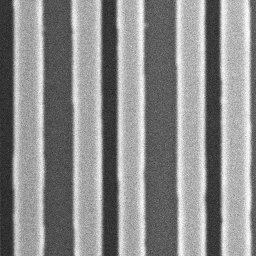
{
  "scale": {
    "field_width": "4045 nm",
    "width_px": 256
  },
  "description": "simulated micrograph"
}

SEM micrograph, lines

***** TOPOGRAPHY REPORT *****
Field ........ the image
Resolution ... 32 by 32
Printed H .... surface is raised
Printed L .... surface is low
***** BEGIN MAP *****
LLHHHLLLLHHHHLLHHHLLLLHHHHLLHHHL
LLHHHLLLLHHHHLLHHHLLLLHHHHLLHHHL
LLHHHLLLLHHHHLLHHHLLLLHHHHLLHHHL
LLHHHLLLLHHHHLLHHHLLLLHHHHLLHHHL
LLHHHLLLLHHHHLLHHHLLLLHHHHLLHHHL
LLHHHLLLLHHHHLLHHHLLLLHHHHLLHHHL
LLHHHLLLLHHHHLLHHHLLLLHHHHLLHHHL
LLHHHLLLLHHHHLLHHHLLLLHHHHLLHHHL
LLHHHLLLLHHHHLLHHHLLLLHHHHLLHHHL
LLHHHLLLLHHHHLLHHHLLLLHHHHLLHHHL
LLHHHLLLLHHHHLLHHHLLLLHHHHLLHHHL
LLHHHLLLLHHHHLLHHHLLLLHHHHLLHHHL
LLHHHLLLLHHHHLLHHHLLLLHHHHLLHHHL
LLHHHLLLLHHHHLLHHHLLLLHHHHLLHHHL
LLHHHLLLLHHHHLLHHHLLLLHHHHLLHHHL
LLHHHLLLLHHHHLLHHHLLLLHHHHLLHHHL
LLHHHLLLLHHHHLLHHHLLLLHHHHLLHHHL
LLHHHLLLLHHHHLLHHHLLLLHHHHLLHHHL
LLHHHLLLLHHHHLLHHHLLLLHHHHLLHHHL
LLHHHLLLLHHHHLLHHHLLLLHHHHLLHHHL
LLHHHLLLLHHHHLLHHHLLLLHHHHLLHHHL
LLHHHLLLLHHHHLLHHHLLLLHHHHLLHHHL
LLHHHLLLLHHHHLLHHHLLLLHHHHLLHHHL
LLHHHLLLLHHHHLLHHHLLLLHHHHLLHHHL
LLHHHLLLLHHHHLLHHHLLLLHHHHLLHHHL
LLHHHLLLLHHHHLLHHHLLLLHHHHLLHHHL
LLHHHLLLLHHHHLLHHHLLLLHHHHLLHHHL
LLHHHLLLLHHHHLLHHHLLLLHHHHLLHHHL
LLHHHLLLLHHHHLLHHHLLLLHHHHLLHHHL
LLHHHLLLLHHHHLLHHHLLLLHHHHLLHHHL
LLHHHLLLLHHHHLLHHHLLLLHHHHLLHHHL
LLHHHLLLLHHHHLLHHHLLLLHHHHLLHHHL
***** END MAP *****